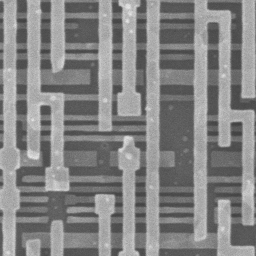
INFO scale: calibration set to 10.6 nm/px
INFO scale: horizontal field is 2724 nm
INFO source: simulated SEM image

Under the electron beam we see wiring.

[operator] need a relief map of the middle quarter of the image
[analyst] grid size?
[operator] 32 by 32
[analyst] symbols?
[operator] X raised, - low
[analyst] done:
---------XXX---XXX---XXX--------
---------XXX---XXX---XXX--------
---------XXX---XXX---XXX--------
---------XXX---XXX---XXX--------
---------XXX---XXX---XXX--------
---------XXX---XXX---XXX--------
---------XXX---XXX---XXX--------
---------XXX--XXXXX--XXX--------
---------XXX--XXXXX--XXX--------
---------XXX--XXXXX--XXX--------
---------XXX--XXXXX--XXX--------
---------XXX--XXXXX--XXX--------
---------XXX--XXXXX--XXX--------
---------XXX---------XXX--------
---------XXX---------XXX--------
---------XXX---------XXX--------
---------XXX---------XXX--------
---------------------XXX--------
---------------XX----XXX--------
---------------XX----XXX--------
---------------XXX---XXX--------
--------------XXXXX--XXX--------
--------------XXXXX--XXX--------
--------------XXXXX--XXX--------
--------------XXXXX--XXX--------
--------------XXXXX--XXX--------
X-------------XXXX---XXX--------
X--------------XX----XXX--------
X--------------XX----XXX--------
X--------------XX----XXX--------
X--------------XX----XXX--------
X--------------XX----XXX--------